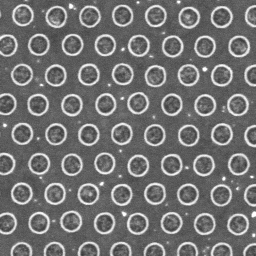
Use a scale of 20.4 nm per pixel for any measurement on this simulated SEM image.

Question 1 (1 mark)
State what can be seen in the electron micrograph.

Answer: a regular array of raised bodies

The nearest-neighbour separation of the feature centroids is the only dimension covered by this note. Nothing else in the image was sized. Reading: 670 nanometers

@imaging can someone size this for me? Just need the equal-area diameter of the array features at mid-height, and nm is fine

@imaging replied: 403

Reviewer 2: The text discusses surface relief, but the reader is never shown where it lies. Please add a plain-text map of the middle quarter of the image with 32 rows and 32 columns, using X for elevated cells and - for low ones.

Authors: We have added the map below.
-----XX------XXX--------------XX
----XXXX-----XXXX----XXXX----XXX
----XXXX----XXXXX----XXXX----XXX
----XXXX----XXXXX----XXXX----XXX
----XXXX-----XXX-----XXXX----XXX
--------------------------------
--------------------------------
------------------XX------------
XXXX-----XXX----XXXX-----XXXX---
XXXX----XXXXX---XXXXX----XXXX---
XXXX----XXXXX---XXXXX----XXXX---
XXXX----XXXX-----XXX-----XXXX---
-XX-------X---------------XX----
--------------------------------
--------------------------------
-----XX------XXX------XX--------
----XXXX----XXXXX----XXXX----XXX
----XXXX----XXXXX---XXXXX----XXX
----XXXX----XXXXX---XXXXX----XXX
-----XXX-----XXX-----XXX-----XXX
--------------------------------
--------------------------------
----------X---------------------
XXXX----XXXX-----XXX-----XXXX---
XXXX----XXXX----XXXXX----XXXX---
XXXX----XXXX----XXXXX----XXXX---
XXXX----XXXX----XXXXX----XXXX---
-XX--------------XXX------XX----
--------------------------------
--------------------------------
-----XX------XXX-----XXX------XX
----XXXX----XXXXX----XXXX----XXX